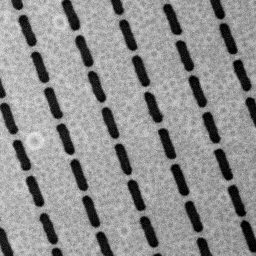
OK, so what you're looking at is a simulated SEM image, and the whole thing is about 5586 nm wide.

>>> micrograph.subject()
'a regular array of holes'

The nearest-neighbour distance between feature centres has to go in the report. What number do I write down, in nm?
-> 837